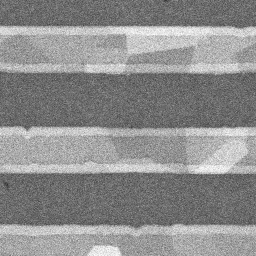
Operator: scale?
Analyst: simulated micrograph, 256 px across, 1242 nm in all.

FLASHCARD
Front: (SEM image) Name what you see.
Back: one or a few lines or trenches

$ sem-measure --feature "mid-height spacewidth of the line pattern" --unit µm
0.302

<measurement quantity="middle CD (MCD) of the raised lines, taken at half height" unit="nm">181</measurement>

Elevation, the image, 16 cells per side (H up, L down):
LLLLLLLLLLLLLLLL
LLLLLLLLLLLLLLLL
HHHHHHHHHHHHHHHH
HHHHHHHHHHHHHHHH
LLLLLLLLLLLLLLLL
LLLLLLLLLLLLLLLL
LLLLLLLLLLLLLLLL
LLLLLLLLLLLLLLLL
HHHHHHHHHHHHHHHH
HHHHHHHHHHHHHHHH
HHHHHLHHHHHHHHHH
LLLLLLLLLLLLLLLL
LLLLLLLLLLLLLLLL
LLLLLLLLLLLLLLLL
HHHHHHHHHHHHHHHH
HHHHHHHHHHHHHHHH